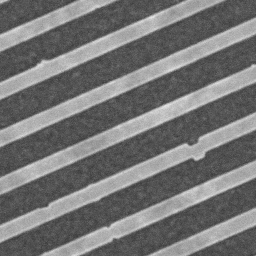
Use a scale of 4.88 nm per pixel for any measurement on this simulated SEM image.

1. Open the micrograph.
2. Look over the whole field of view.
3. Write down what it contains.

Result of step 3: parallel lines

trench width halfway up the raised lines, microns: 0.14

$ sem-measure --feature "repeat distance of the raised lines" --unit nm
213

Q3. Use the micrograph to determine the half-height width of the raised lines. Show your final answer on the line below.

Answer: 14.8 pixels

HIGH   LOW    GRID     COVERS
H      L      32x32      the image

LLLLLLLLLHHHHLLLLLLLLLHHHHHLLLLL
LLLLLLHHHHHLLLLLLLLLHHHHHLLLLLLL
LLLLHHHHHLLLLLLLLLHHHHLLLLLLLLLH
LLHHHHHLLLLLLLLLHHHHLLLLLLLLLHHH
HHHHLLLLLLLLLHHHHHLLLLLLLLLHHHHL
HHLLLLLLLLLHHHHHLLLLLLLLLHHHHLLL
LLLLLLLLLHHHHLLLLLLLLLHHHHHLLLLL
LLLLLLHHHHHLLLLLLLLLHHHHHLLLLLLL
LLLLHHHHHLLLLLLLLLHHHHLLLLLLLLLH
LLHHHHLLLLLLLLLLHHHHLLLLLLLLLHHH
HHHHLLLLLLLLLHHHHHLLLLLLLLHHHHHL
HHLLLLLLLLLHHHHHLLLLLLLLHHHHHLLL
LLLLLLLLLHHHHLLLLLLLLLHHHHHLLLLL
LLLLLLLHHHHLLLLLLLLLHHHHLLLLLLLL
LLLLHHHHHLLLLLLLLHHHHHLLLLLLLLLH
LLHHHHHLLLLLLLLHHHHHLLLLLLLLLHHH
HHHHLLLLLLLLLHHHHHLLLLLLLLLHHHHL
HHLLLLLLLLLHHHHLLLLLLLLLLHHHHLLL
LLLLLLLLHHHHHLLLLLLLLLHHHHHLLLLL
LLLLLLHHHHHLLLLLLLLLHHHHHLLLLLLL
LLLLHHHHHLLLLLLLLHHHHHLLLLLLLLLH
LLHHHHLLLLLLLLLHHHHHLLLLLLLLLHHH
HHHHLLLLLLLLLHHHHHLLLLLLLLHHHHHL
HHLLLLLLLLLHHHHLLLLLLLLLHHHHHLLL
LLLLLLLLHHHHHLLLLLLLLLHHHHHLLLLL
LLLLLLHHHHHLLLLLLLLLHHHHLLLLLLLL
LLLLHHHHLLLLLLLLLLHHHHLLLLLLLLLH
LLHHHHLLLLLLLLLHHHHHLLLLLLLLLHHH
HHHHLLLLLLLLLHHHHHLLLLLLLLHHHHHL
HHLLLLLLLLLHHHHLLLLLLLLLHHHHHLLL
LLLLLLLLHHHHHLLLLLLLLLHHHHHLLLLL
LLLLLLHHHHHLLLLLLLLLHHHHLLLLLLLL